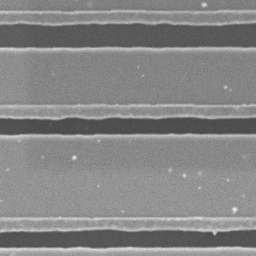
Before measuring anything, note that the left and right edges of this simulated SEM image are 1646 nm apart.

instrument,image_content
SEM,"lines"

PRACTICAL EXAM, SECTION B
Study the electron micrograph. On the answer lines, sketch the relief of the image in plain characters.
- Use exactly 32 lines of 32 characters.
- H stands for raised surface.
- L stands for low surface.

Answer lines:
HHHHHHHHHHHHHHHHHHHHHHHHHHHHHHHH
HHHHHHHHHHHHHHHHHHHHHHHHHHHHHHHH
HHHHHHHHHHHHHHHHHHHHHHHHHHHHHHHH
LLLLLLLLLLLLLLLLLLLLLLLLLLLLLLLL
LLLLLLLLLLLLLLLLLLLLLLLLLLLLLLLL
LLLLLLLLLLLLLLLLLLLLLLLLLLLLLLLL
HHHHHHHHHHHHHHHHHHHHHHHHHHHHHHHH
HHHHHHHHHHHHHHHHHHHHHHHHHHHHHHHH
HHHHHHHHHHHHHHHHHHHHHHHHHHHHHHHH
HHHHHHHHHHHHHHHHHHHHHHHHHHHHHHHH
HHHHHHHHHHHHHHHHHHHHHHHHHHHHHHHH
HHHHHHHHHHHHHHHHHHHHHHHHHHHHHHHH
HHHHHHHHHHHHHHHHHHHHHHHHHHHHHHHH
HHHHHHHHHHHHHHHHHHHHHHHHHHHHHHHH
HHHHHHHHHHHHHHHHHHHHHHHHHHHHHHHH
LLLLLLLLLLLLLLLLLLLLLLLLLLLLLLLL
LLLLLLLLLLLLLLLLLLLLLLLLLLLLLLLL
HHHHHHHHHHHHHHHHHHHHHHHHHHHHHHHH
HHHHHHHHHHHHHHHHHHHHHHHHHHHHHHHH
HHHHHHHHHHHHHHHHHHHHHHHHHHHHHHHH
HHHHHHHHHHHHHHHHHHHHHHHHHHHHHHHH
HHHHHHHHHHHHHHHHHHHHHHHHHHHHHHHH
HHHHHHHHHHHHHHHHHHHHHHHHHHHHHHHH
HHHHHHHHHHHHHHHHHHHHHHHHHHHHHHHH
HHHHHHHHHHHHHHHHHHHHHHHHHHHHHHHH
HHHHHHHHHHHHHHHHHHHHHHHHHHHHHHHH
HHHHHHHHHHHHHHHHHHHHHHHHHHHHHHHH
HHHHHHHHHHHHHHHHHHHHHHHHHHHHHHHH
HHHHHHHHHHHHHHHHHHHHHHHHHHHHHHHH
LLLLLLLLLLLLLLLLLLLLLLLLLLLLLLLL
LLLLLLLLLLLLLLLLLLLLLLLLLLLLLLLL
HHHHHHHHHHHHHHHHHHHHHHHHHHHHHHHH